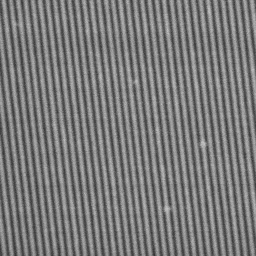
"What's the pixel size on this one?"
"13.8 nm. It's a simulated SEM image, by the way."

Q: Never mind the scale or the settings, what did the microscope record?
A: parallel lines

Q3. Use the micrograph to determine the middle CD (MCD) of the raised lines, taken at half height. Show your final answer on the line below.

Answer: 65.3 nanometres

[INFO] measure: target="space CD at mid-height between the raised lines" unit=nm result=39.5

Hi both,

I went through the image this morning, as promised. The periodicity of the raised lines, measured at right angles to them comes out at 100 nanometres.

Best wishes